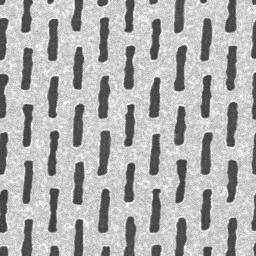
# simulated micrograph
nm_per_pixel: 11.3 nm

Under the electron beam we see a regular array of holes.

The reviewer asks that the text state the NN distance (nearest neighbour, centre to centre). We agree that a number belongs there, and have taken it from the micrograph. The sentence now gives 0.426 microns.